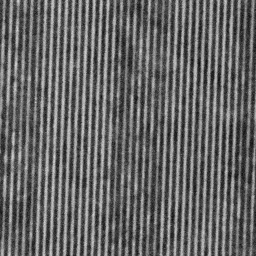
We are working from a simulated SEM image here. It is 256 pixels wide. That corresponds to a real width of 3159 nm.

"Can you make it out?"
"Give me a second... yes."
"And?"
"parallel lines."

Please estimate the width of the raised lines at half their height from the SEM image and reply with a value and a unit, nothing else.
1.75 pixels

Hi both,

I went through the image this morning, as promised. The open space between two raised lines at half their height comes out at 63.2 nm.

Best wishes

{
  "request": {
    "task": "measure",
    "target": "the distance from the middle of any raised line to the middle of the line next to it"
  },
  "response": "85.1 nm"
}